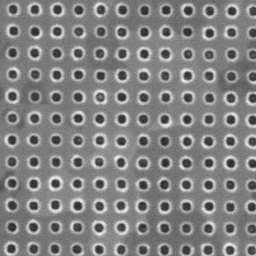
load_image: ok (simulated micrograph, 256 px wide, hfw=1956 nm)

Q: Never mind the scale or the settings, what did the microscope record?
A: a regular array of holes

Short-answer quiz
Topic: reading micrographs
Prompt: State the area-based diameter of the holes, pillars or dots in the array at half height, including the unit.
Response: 77.6 nanometers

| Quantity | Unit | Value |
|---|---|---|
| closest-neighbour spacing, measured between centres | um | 0.165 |